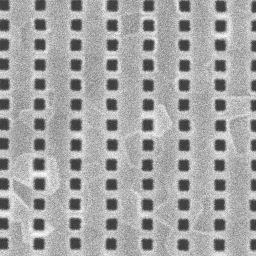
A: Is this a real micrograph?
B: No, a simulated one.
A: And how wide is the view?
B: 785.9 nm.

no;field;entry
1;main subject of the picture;a regular array of holes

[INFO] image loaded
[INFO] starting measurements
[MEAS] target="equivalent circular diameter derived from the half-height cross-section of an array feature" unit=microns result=0.0396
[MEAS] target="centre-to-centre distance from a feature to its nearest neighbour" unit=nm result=60.2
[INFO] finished